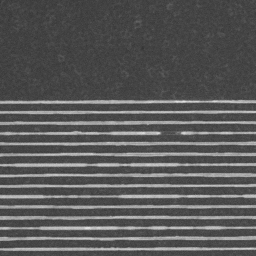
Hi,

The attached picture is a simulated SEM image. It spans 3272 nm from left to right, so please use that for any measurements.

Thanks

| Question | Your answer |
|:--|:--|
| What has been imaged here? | parallel lines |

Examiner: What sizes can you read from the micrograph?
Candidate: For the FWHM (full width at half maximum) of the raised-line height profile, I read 32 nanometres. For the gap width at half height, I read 107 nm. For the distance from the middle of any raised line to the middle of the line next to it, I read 0.134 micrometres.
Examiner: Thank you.